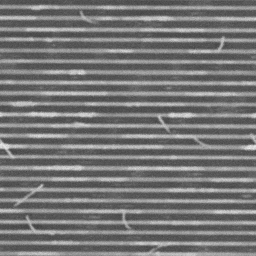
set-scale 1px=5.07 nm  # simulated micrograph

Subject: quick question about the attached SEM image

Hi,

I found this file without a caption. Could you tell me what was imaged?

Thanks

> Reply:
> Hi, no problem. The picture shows parallel lines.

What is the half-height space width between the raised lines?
39.3 nanometres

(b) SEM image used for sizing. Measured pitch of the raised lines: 54.2 nanometers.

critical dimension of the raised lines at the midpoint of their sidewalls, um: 0.0146